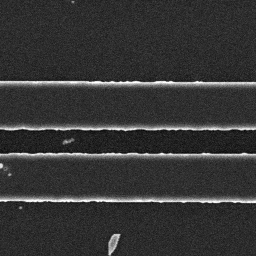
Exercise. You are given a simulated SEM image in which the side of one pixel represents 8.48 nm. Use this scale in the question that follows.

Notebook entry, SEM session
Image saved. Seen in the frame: lines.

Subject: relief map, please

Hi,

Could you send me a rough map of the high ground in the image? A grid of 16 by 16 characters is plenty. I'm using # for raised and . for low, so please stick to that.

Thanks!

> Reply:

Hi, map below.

................
................
................
................
................
################
################
################
................
................
################
################
################
................
................
................